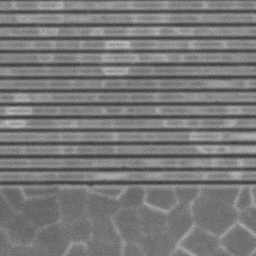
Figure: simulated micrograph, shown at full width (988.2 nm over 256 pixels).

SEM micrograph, parallel lines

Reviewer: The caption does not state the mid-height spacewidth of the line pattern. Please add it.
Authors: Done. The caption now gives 19.8 nanometres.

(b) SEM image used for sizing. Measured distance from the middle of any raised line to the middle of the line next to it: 50.8 nanometers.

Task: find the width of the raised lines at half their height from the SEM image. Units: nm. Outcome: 29.9